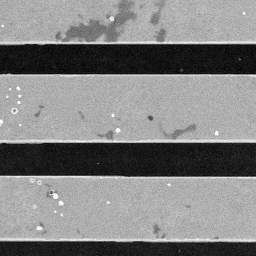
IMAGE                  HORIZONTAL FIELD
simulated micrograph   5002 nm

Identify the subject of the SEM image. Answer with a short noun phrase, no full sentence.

lines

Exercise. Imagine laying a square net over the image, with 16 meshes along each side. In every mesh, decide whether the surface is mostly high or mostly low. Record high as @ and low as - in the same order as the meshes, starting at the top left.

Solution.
@@@@@@@@@@@@@@@@
@@@@@@@@@@@@@@@@
@@@@@@@@@@@@@@@@
----------------
----------------
@@@@@@@@@@@@@@@@
@@@@@@@@@@@@@@@@
@@@@@@@@@@@@@@@@
@@@@@@@@@@@@@@@@
----------------
----------------
@@@@@@@@@@@@@@@@
@@@@@@@@@@@@@@@@
@@@@@@@@@@@@@@@@
@@@@@@@@@@@@@@@@
----------------